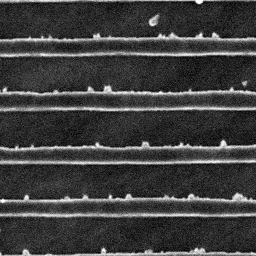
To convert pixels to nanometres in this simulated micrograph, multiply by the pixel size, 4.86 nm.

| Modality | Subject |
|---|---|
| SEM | lines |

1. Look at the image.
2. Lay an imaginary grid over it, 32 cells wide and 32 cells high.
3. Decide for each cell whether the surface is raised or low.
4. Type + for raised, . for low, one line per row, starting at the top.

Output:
................................
................................
................................
................................
................................
++++++++++++++++++++++++++++++++
++++++++++++++++++++++++++++++++
................................
................................
................................
................................
..........................+++++.
++++++++++++++++++++++++++++++++
++++++++++++++++++++++++++++++++
................................
................................
................................
................................
+....+++++++++.+++++++++++++++++
++++++++++++++++++++++++++++++++
................................
................................
................................
................................
................................
++++++++++++++++++++++++++++++++
++++++++++++++++++++++++++++++++
................................
................................
................................
................................
................................